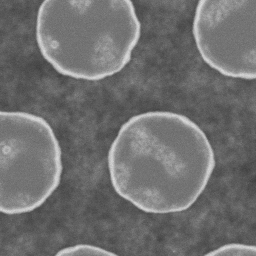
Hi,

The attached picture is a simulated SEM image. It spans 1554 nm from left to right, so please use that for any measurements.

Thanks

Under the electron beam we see raised bodies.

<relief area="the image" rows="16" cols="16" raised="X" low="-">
---XXXXX----XXXX
--XXXXXXX---XXXX
--XXXXXX----XXXX
---XXXXX-----XXX
----XXX-------XX
----------------
----------------
XXX-----XXXX----
XXX----XXXXXX---
XXXX---XXXXXX---
XXXX---XXXXXX---
XXX----XXXXXX---
XXX-----XXXX----
----------------
----------------
-----X--------XX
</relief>